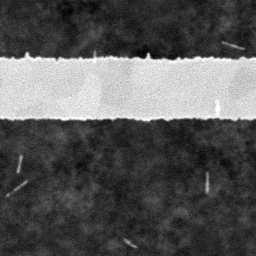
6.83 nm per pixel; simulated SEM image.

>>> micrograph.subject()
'one or a few lines or trenches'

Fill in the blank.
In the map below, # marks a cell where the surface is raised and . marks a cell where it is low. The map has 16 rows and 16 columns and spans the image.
................
................
................
................
################
################
################
........##......
................
................
................
................
................
...........#....
................
................